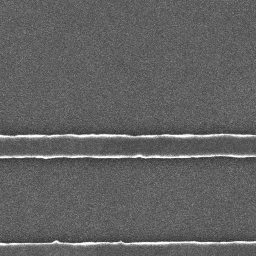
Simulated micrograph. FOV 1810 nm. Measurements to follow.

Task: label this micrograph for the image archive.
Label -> one or a few lines or trenches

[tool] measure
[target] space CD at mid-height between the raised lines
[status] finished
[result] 0.606 microns